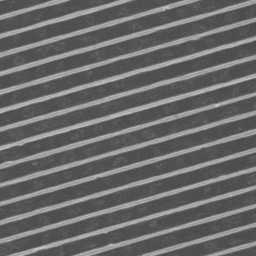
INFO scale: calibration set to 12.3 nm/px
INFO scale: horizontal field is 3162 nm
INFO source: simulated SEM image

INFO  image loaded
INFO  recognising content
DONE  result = parallel lines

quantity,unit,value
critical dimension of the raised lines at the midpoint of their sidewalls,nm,49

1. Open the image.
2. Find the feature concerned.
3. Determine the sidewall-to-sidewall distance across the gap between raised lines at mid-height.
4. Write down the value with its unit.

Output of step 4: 168 nm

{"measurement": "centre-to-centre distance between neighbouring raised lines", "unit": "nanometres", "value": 222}